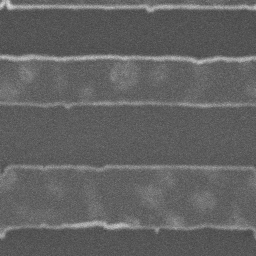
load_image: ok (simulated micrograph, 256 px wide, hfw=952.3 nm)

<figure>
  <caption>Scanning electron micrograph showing one or a few lines or trenches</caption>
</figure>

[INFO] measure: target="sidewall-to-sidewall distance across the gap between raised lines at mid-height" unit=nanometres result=202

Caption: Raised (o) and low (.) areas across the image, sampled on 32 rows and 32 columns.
oooooooooooooooooooooooooooooooo
................................
................................
................................
................................
................................
................................
oooooooooooooooooooooooooooooooo
oooooooooooooooooooooooooooooooo
oooooooooooooooooooooooooooooooo
oooooooooooooooooooooooooooooooo
oooooooooooooooooooooooooooooooo
oooooooooooooooooooooooooooooooo
................................
................................
................................
................................
................................
................................
................................
................................
oooooooooooooooooooooooooooooooo
oooooooooooooooooooooooooooooooo
oooooooooooooooooooooooooooooooo
oooooooooooooooooooooooooooooooo
oooooooooooooooooooooooooooooooo
oooooooooooooooooooooooooooooooo
oooooooooooooooooooooooooooooooo
oo....oo.....oo..oooooooo..ooooo
................................
................................
................................